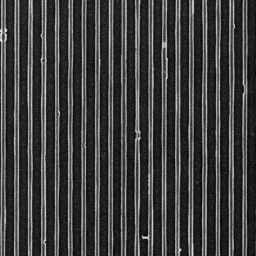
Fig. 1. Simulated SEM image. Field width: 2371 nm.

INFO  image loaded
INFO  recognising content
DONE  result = parallel lines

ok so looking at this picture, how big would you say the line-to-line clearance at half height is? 0.0891 microns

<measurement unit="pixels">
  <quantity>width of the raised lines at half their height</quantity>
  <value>3.88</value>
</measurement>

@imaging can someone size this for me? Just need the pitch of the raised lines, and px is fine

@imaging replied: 13.4